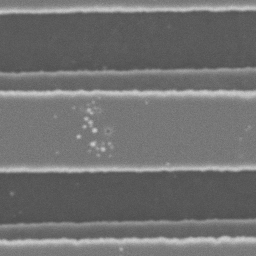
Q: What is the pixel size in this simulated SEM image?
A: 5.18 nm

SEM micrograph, lines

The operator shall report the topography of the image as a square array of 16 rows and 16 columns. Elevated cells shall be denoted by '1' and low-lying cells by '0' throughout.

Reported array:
1111111111111111
0000000000000000
0000000000000000
0000000000000000
0000000000001111
1111111110111111
1111111111111111
1111111111111111
1111111111111111
1111111111111111
1111111111111111
0000000000000000
0000000000000000
0000000000000000
1111111011111111
1111111111111111